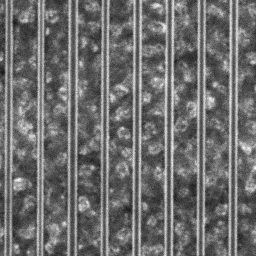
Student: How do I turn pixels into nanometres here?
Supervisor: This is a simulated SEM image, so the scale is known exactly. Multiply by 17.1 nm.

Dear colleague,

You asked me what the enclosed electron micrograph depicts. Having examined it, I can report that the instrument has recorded parallel lines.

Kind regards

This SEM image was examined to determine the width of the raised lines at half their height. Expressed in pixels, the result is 6.5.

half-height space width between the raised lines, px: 25.3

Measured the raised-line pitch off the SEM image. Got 548 nanometres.